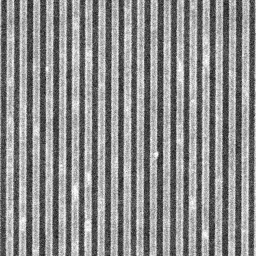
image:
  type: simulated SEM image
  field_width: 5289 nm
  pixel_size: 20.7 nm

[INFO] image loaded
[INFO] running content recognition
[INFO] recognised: parallel lines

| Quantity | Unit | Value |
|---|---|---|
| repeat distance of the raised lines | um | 0.27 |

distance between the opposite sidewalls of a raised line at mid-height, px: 6.13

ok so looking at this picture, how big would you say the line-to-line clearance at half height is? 145 nanometers